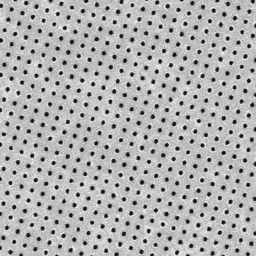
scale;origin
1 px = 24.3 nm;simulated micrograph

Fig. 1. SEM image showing a regular array of holes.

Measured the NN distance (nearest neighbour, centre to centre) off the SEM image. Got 262 nm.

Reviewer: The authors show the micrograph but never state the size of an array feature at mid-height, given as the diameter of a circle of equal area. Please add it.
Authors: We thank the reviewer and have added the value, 0.116 um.